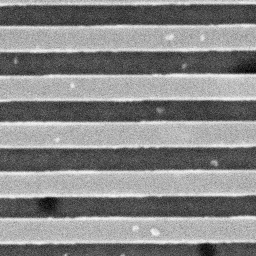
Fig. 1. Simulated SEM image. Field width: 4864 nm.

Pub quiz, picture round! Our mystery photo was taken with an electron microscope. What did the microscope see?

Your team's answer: lines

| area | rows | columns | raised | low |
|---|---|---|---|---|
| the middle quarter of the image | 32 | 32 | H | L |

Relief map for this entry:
LLLLLLLLLLLLLLLLLLLLLLLLLLLLLLLL
LLLLLLLLLLLLLLLLLLLLLLLLLLLLLLLL
LLLLLLLLLLLLLLLLLLLLLLLLLLLLLLLL
HHHHHHHHHHHHHHHHHHHHHHHHHHHHHHHH
HHHHHHHHHHHHHHHHHHHHHHHHHHHHHHHH
HHHHHHHHHHHHHHHHHHHHHHHHHHHHHHHH
HHHHHHHHHHHHHHHHHHHHHHHHHHHHHHHH
HHHHHHHHHHHHHHHHHHHHHHHHHHHHHHHH
HHHHHHHHHHHHHHHHHHHHHHHHHHHHHHHH
LLLLLLLLLLLLLLLLLLLLLLLLLLLLLLLL
LLLLLLLLLLLLLLLLLLLLLLLLLLLLLLLL
LLLLLLLLLLLLLLLLLLLLLLLLLLLLLLLL
LLLLLLLLLLLLLLLLLLLLLLLLLLLLLLLL
LLLLLLLLLLLLLLLLLLLLLLLLLLLLLLLL
LLLLLLLLLLLLLLLLLLLLLLLLLLLLLLLL
HHHHHHHHHHHHHHHHHHHHHHHHHHHHHHHH
HHHHHHHHHHHHHHHHHHHHHHHHHHHHHHHH
HHHHHHHHHHHHHHHHHHHHHHHHHHHHHHHH
HHHHHHHHHHHHHHHHHHHHHHHHHHHHHHHH
HHHHHHHHHHHHHHHHHHHHHHHHHHHHHHHH
HHHHHHHHHHHHHHHHHHHHHHHHHHHHHHHH
LLLLLLLLLLLLLLLLLLLLLLLLLLLLLLLL
LLLLLLLLLLLLLLLLLLLLLLLLLLLLLLLL
LLLLLLLLLLLLLLLLLLLLLLLLLLLLLLLL
LLLLLLLLLLLLLLLLLLLLLLLLLLLLLLLL
LLLLLLLLLLLLLLLLLLLLLLLLLLLLLLLL
LLLLLLLLLLLLLLLLLLLLLLLLLLLLLLLL
HHHHHHHHHHHHHHHHHHHHHHHHHHHHHHHH
HHHHHHHHHHHHHHHHHHHHHHHHHHHHHHHH
HHHHHHHHHHHHHHHHHHHHHHHHHHHHHHHH
HHHHHHHHHHHHHHHHHHHHHHHHHHHHHHHH
HHHHHHHHHHHHHHHHHHHHHHHHHHHHHHHH